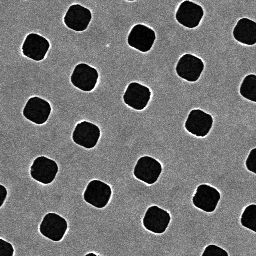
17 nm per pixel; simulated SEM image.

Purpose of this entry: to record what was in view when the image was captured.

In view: a regular array of holes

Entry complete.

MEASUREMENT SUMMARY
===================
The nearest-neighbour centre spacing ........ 937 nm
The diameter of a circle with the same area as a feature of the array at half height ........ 457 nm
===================